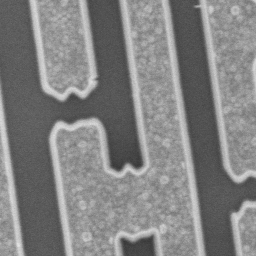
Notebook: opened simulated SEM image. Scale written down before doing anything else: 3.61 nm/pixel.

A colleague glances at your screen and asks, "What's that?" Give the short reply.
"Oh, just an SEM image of one or a few lines or trenches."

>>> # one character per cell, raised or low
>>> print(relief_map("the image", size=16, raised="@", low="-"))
--@@@---@@---@@@
--@@@---@@@--@@@
--@@@@--@@@--@@@
--@@@@--@@@--@@@
---@@@--@@@--@@@
---@@@--@@@--@@@
---------@@---@@
---------@@---@@
---@@@---@@@--@@
---@@@@--@@@--@@
@---@@@--@@@--@@
@---@@@@@@@@----
@---@@@@@@@@----
@---@@@@@@@@---@
@---@@@@@@@@---@
@---@@@---@@@--@